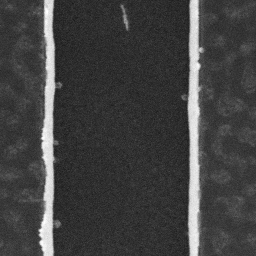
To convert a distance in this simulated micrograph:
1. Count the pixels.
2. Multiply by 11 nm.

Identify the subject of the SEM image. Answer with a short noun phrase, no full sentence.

one or a few lines or trenches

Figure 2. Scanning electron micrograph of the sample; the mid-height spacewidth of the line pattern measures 1560 nm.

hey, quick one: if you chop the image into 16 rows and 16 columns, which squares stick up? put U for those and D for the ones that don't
UUUDDDDDDDDDUUUU
UUUDDDDDDDDDUUUU
UUUDDDDDDDDDUUUU
UUUDDDDDDDDDUUUU
UUUDDDDDDDDDUUUU
UUUDDDDDDDDDUUUU
UUUDDDDDDDDDUUUU
UUUDDDDDDDDDUUUU
UUUDDDDDDDDDUUUU
UUUDDDDDDDDDUUUU
UUUDDDDDDDDDUUUU
UUUDDDDDDDDDUUUU
UUUDDDDDDDDDUUUU
UUUDDDDDDDDDUUUU
UUUDDDDDDDDDUUUU
UUUDDDDDDDDDUUUU